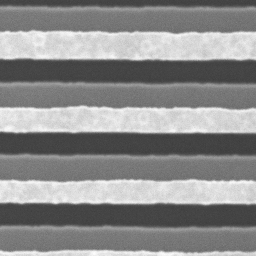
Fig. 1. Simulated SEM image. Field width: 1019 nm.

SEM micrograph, lines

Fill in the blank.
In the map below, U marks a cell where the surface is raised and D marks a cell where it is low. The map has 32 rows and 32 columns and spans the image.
DDDDDDDDDDDDDDDDDDDDDDDDDDDDDDDD
UUUUUUUUUUUUUUUUUUUUUUUUUUUUUUUU
UUUUUUUUUUUUUUUUUUUUUUUUUUUUUUUU
UUUUUUUUUUUUUUUUUUUUUUUUUUUUUUUU
UUUUUUUUUUUUUUUUUUUUUUUUUUUUUUUU
UUUUUUUUUUUUUUUUUUUUUUUUUUUUUUUU
UUUUUUUUUUUUUUUUUUUUUUUUUUUUUUUU
DDDDDDDDDDDDDDDDDDDDDDDDDDDDDDDD
DDDDDDDDDDDDDDDDDDDDDDDDDDDDDDDD
DDDDDDDDDDDDDDDDDDDDDDDDDDDDDDDD
UUUUUUUUUUUUUUUUUUDDDUUUUUUDUDDD
UUUUUUUUUUUUUUUUUUUUUUUUUUUUUUUU
UUUUUUUUUUUUUUUUUUUUUUUUUUUUUUUU
UUUUUUUUUUUUUUUUUUUUUUUUUUUUUUUU
UUUUUUUUUUUUUUUUUUUUUUUUUUUUUUUU
UUUUUUUUUUUUUUUUUUUUUUUUUUUUUUUU
DUUUUDDDUUDDDDDUUUUUUUUUUUUUUUUU
DDDDDDDDDDDDDDDDDDDDDDDDDDDDDDDD
DDDDDDDDDDDDDDDDDDDDDDDDDDDDDDDD
UUUUUUUUDUUUUUUUUDUUDUUDUUUDDUDD
UUUUUUUUUUUUUUUUUUUUUUUUUUUUUUUU
UUUUUUUUUUUUUUUUUUUUUUUUUUUUUUUU
UUUUUUUUUUUUUUUUUUUUUUUUUUUUUUUU
UUUUUUUUUUUUUUUUUUUUUUUUUUUUUUUU
UUUUUUUUUUUUUUUUUUUUUUUUUUUUUUUU
DDDDDDDDDDDDDDDDDDDDDDDDDDDDDDDD
DDDDDDDDDDDDDDDDDDDDDDDDDDDDDDDD
DDDDDDDDDDDDDDDDDDDDDDDDDDDDDDDD
UUUUUUUUUUUUUUUUUUDDDDDUUDUUUUUU
UUUUUUUUUUUUUUUUUUUUUUUUUUUUUUUU
UUUUUUUUUUUUUUUUUUUUUUUUUUUUUUUU
UUUUUUUUUUUUUUUUUUUUUUUUUUUUUUUU